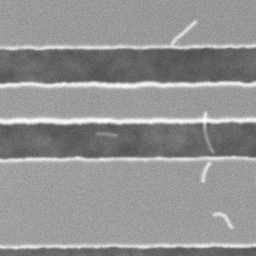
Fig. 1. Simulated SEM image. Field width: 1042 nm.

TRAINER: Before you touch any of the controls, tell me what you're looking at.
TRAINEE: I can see lines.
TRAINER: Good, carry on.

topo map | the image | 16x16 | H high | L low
HHHHHHHHHHHHHHHH
HHHHHHHHHHHHHHHH
HHHHHHHHHHHHHHHH
LLLLLLLLLLLLLLLL
LLLLLLLLLLLLLLLL
HHHHHHHHHHHHHHHH
HHHHHHHHHHHHHHHH
HHHHHHHHHHHHHHHH
LLLLLLLLLLLLLLLL
LLLLLLLLLLLLLLLL
HHHHHHHHHHHHHHHH
HHHHHHHHHHHHHHHH
HHHHHHHHHHHHHHHH
HHHHHHHHHHHHHHHH
HHHHHHHHHHHHHHHH
HHLLLLLLLLLLLLLL